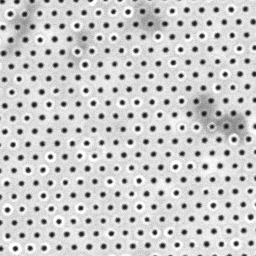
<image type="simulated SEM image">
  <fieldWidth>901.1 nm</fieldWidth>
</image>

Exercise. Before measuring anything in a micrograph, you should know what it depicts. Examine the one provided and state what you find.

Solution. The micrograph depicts a regular array of holes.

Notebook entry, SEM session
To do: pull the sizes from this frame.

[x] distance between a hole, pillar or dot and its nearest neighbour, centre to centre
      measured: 50.8 nm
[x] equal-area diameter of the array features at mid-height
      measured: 19 nm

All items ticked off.